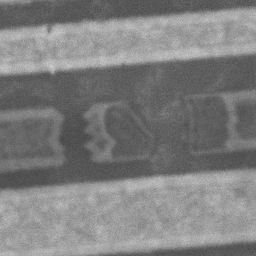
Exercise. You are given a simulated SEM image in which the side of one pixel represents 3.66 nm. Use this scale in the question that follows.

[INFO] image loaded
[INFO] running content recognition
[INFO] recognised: one or a few lines or trenches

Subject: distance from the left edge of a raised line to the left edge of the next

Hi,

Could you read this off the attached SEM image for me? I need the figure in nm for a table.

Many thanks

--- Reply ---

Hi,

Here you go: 320